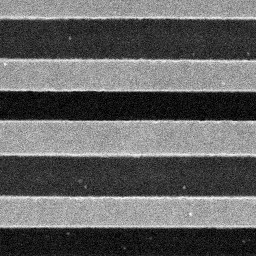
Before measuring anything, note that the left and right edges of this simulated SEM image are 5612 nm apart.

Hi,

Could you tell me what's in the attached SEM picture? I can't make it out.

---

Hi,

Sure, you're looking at lines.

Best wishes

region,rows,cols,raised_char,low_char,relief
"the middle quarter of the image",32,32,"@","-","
@@@@@@@@@@@@@@@@@@@@@@@@@@@@@@@@
@@@@@@@@@@@@@@@@@@@@@@@@@@@@@@@@
@@@@@@@@@@@@@@@@@@@@@@@@@@@@@@@@
@@@@@@@@@@@@@@@@@@@@@@@@@@@@@@@@
@@@@@@@@@@@@@@@@@@@@@@@@@@@@@@@@
@@@@@@@@@@@@@@@@@@@@@@@@@@@@@@@@
@@@@@@@@@@@@@@@@@@@@@@@@@@@@@@@@
--------------------------------
--------------------------------
--------------------------------
--------------------------------
--------------------------------
--------------------------------
--------------------------------
@@@@@@@@@@@@@@@@@@@@@@@@@@@@@@@@
@@@@@@@@@@@@@@@@@@@@@@@@@@@@@@@@
@@@@@@@@@@@@@@@@@@@@@@@@@@@@@@@@
@@@@@@@@@@@@@@@@@@@@@@@@@@@@@@@@
@@@@@@@@@@@@@@@@@@@@@@@@@@@@@@@@
@@@@@@@@@@@@@@@@@@@@@@@@@@@@@@@@
@@@@@@@@@@@@@@@@@@@@@@@@@@@@@@@@
@@@@@@@@@@@@@@@@@@@@@@@@@@@@@@@@
@@@@@@@@@@@@@@@@@@@@@@@@@@@@@@@@
--------------------------------
--------------------------------
--------------------------------
--------------------------------
--------------------------------
--------------------------------
--------------------------------
--------------------------------
--------------------------------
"